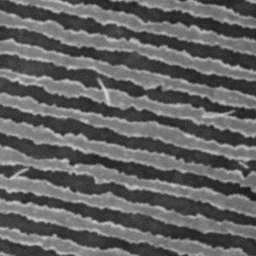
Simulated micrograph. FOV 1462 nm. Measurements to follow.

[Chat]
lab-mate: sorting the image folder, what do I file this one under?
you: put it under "parallel lines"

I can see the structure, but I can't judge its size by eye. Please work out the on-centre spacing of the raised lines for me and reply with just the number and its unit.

148 nm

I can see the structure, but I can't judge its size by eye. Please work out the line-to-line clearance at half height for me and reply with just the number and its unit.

80.2 nm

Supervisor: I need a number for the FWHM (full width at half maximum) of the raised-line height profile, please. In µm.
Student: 0.068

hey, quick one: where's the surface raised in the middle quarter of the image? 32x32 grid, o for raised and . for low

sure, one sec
oooooooooooo.oo..............ooo
........ooooooooo...............
..........ooooooooooooo.........
.............oooooooooooooo.....
ooo..............oooooooooooooo.
ooooo...............ooo.oooooooo
ooooooooooooo............o....oo
oooooooooooooooo................
.......oooooooooo..oo...........
..........ooooooooooooo.........
............oooooooooooooooooooo
oo...................ooooooooooo
oooooooo...............ooooooooo
..oooooooo......................
.....ooooooooooo......o.........
........oooooooooooooooooo......
............ooooooooooooooooo...
..............oooooooooooooooo..
ooooo.................oooooooooo
oooooooo.................ooooooo
..oooooooooooo...............ooo
....ooooooooooooo...............
.........oooooooooooooo.o.......
...........ooooooooooooooooo....
o..................ooooooooooo..
o..ooooooo............oooooooooo
ooooooooooooo............oo..ooo
......ooooooooo.................
........oooooooooo..............
........oo...ooooooooooo........
................ooooooooooooo...
o.....................oooooooooo